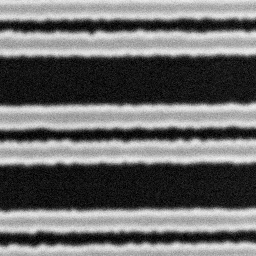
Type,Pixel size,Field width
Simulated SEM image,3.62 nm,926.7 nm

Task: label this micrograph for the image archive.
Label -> lines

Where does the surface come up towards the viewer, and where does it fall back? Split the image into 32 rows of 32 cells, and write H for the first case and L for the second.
HHHHHHHHHHHHHHHHHHHHHHHHHHHHHHHH
HHHHHHHHHHHHHHHHHHHHHHHHHHHHHHHH
LLLLHLLLLLLLLLLLLLLLLLLLLLLLLLLL
LLLLLLLLLLLLLLLLLLLLLLLLLLLLLLLL
HHHHHHHHHHHHHHHHHHHHHHHHHHHHHHHH
HHHHHHHHHHHHHHHHHHHHHHHHHHHHHHHH
HHHHHHHHHHHHHHHHHHHHHHHHHHHHHHHH
LLLLLLLLLLLLLLLLLLLLLLLLLLLLLLLL
LLLLLLLLLLLLLLLLLLLLLLLLLLLLLLLL
LLLLLLLLLLLLLLLLLLLLLLLLLLLLLLLL
LLLLLLLLLLLLLLLLLLLLLLLLLLLLLLLL
LLLLLLLLLLLLLLLLLLLLLLLLLLLLLLLL
LLLLLLLLLLLLLLLLLLLLLLLLLLLLLLLL
HHHHHHHHHHHHHHHHHHHHHHHHHHHHHHHH
HHHHHHHHHHHHHHHHHHHHHHHHHHHHHHHH
HHHHHHHHHHHHHHHHHHHHHHHHHHHHHHHH
LLLLLLLLLLLLLLLLLLLLLLLLLLLLLLLL
LLLLLLLLLLLLLLLLLLLLLLLLHLLLLLLL
HHHHHHHHHHHHHHHHHHHHHHHHHHHHHHHH
HHHHHHHHHHHHHHHHHHHHHHHHHHHHHHHH
LLLHLLLLLLLLLLLLLLLLLLLLLLLLLLLL
LLLLLLLLLLLLLLLLLLLLLLLLLLLLLLLL
LLLLLLLLLLLLLLLLLLLLLLLLLLLLLLLL
LLLLLLLLLLLLLLLLLLLLLLLLLLLLLLLL
LLLLLLLLLLLLLLLLLLLLLLLLLLLLLLLL
LLLLLLLLLLLLLLLLLLLLLLLLLLLLLLLL
LLHHHHHHLHLHHHHHHHHHHHHHHHHHHHHH
HHHHHHHHHHHHHHHHHHHHHHHHHHHHHHHH
HHHHHHHHHHHHHHHHHHHHHHHHHHHHHHHH
LLLLLLLLLLLLLLLLLLLLLLLLLLLLLLLL
LLLLLLLLLLLLLLLLLLLLLLLLLLLLHLHL
HHHHHHHHHHHHHHHHHHHHHHHHHHHHHHHH